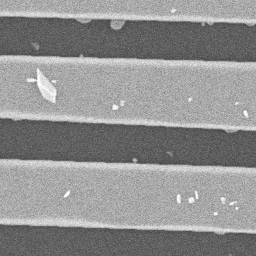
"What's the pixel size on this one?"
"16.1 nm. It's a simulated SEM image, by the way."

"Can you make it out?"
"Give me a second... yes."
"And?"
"lines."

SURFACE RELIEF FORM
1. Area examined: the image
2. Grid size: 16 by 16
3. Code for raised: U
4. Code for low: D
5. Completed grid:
UUUUUUUUUUUUUUUU
DDDDDDDDDDDDDDDD
DDDDDDDDDDDDDDDD
UUDDDDDDDDDDDDDD
UUUUUUUUUUUUUUUU
UUUUUUUUUUUUUUUU
UUUUUUUUUUUUUUUU
DDDUUUUUUUUUUUUU
DDDDDDDDDDDDDDDD
DDDDDDDDDDDDDDDD
UUUUUUUUUUUUUUUD
UUUUUUUUUUUUUUUU
UUUUUUUUUUUUUUUU
UUUUUUUUUUUUUUUU
DDDDDDDDDDDDDDDU
DDDDDDDDDDDDDDDD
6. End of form